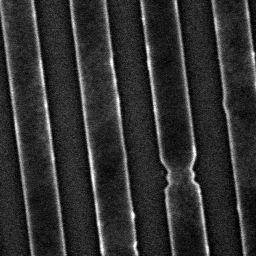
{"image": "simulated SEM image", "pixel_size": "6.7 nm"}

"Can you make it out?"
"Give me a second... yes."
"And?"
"one or a few lines or trenches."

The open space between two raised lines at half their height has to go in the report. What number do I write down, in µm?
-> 0.237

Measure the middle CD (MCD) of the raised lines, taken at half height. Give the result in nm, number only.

237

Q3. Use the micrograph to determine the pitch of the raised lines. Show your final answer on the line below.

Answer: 471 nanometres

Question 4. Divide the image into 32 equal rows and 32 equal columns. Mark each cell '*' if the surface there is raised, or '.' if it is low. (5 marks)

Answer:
****.....****.....****.....****.
****.....****.....****.....****.
****.....****.....****.....****.
*****....*****....****.....****.
*****....*****....*****....****.
.****....*****....*****....*****
.****.....****....*****....*****
.****.....****....*****....*****
.****.....****.....****.....****
.****.....****.....****.....****
.****.....*****....****.....****
.*****....*****....****.....****
.*****....*****....*****....****
..****....*****....*****....****
..****.....****....*****....****
..****.....****.....****....****
..****.....****.....****.....***
..****.....****.....****.....***
..*****....*****....****.....***
..*****....*****....****.....***
...****....*****....****.....***
...****....*****.....***.....***
...****.....****.....***.....***
...****.....****.....****....***
...****.....****.....****.....**
...****.....****.....****.....**
...*****....*****....****.....**
...*****....*****....****.....**
....****....*****....*****....**
....****....*****....*****....**
....****.....****....*****....**
....****.....****.....****....**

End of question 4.